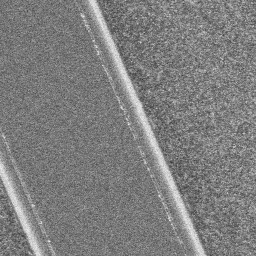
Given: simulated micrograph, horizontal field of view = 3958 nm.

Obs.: one or a few lines or trenches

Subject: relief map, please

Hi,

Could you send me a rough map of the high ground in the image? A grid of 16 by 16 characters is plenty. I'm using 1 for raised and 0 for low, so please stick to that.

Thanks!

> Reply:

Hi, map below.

1111110000000000
1111110000000000
1111111000000000
1111111000000000
1111111100000000
1111111100000000
1111111110000000
1111111110000000
1111111110000000
1111111111000000
1111111111000000
1111111111100000
0111111111100000
0111111111110000
0011111111110000
0011111111111000